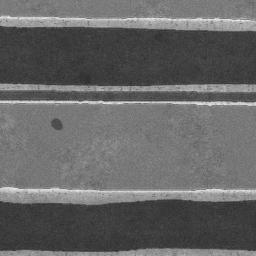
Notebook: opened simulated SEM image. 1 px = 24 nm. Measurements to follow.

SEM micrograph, lines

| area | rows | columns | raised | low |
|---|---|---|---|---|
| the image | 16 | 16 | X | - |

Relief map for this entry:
XXXXXXXXXXXXXXXX
----------------
----------------
----------------
----------------
----------------
XXXXXXXXXXXXXXXX
XXXXXXXXXXXXXXXX
XXXXXXXXXXXXXXXX
XXXXXXXXXXXXXXXX
XXXXXXXXXXXXXXXX
XXXXXXXXXXXXXXXX
----------------
----------------
----------------
----------------